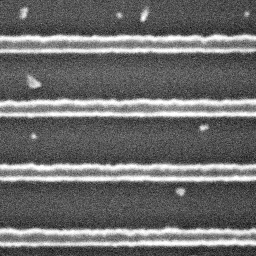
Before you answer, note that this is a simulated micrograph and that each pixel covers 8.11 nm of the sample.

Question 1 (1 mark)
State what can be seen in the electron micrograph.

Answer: lines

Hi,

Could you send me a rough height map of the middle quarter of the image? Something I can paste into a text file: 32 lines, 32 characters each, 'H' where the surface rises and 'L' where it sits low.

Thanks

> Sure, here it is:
LLLLLLLLLLLLLLLLLLLLLLLLLLLLLLLL
LLLLLLLLLLLLLLLLLLLLLLLLLLLLLLLL
LLLLLLLLLLLLLLLLLLLLLLLLLLLLLLLL
LLLLLLLLLLLLLLLLLLLLLLLLLLLLLLLL
LLLLLLLLLLLLLLLLLLLLLLLLLLLLLLLL
LLLLLLLLLLLLLLLLLLLLLLLLLLLLLLLL
LLLLLLLLLLLLLLLLLLLLLLLLLLLLLLLL
LLLLLLLLLLLLLLLLLLLLLLLLLLLLLLLL
LLLLLLLLLLLLLLLLLLLLLLLLLLLLLLLL
HHHHLLLHHHHHHLLHHHHHHHHHHHHHHHHH
HHHHHHHHHHHHHHHHHHHHHHHHHHHHHHHH
HHHHHHHHHHHHHHHHHHHHHHHHHHHHHHHH
HHHHHHHHHHHHHHHHHHHHHHHHHHHHHHHH
LLLLLLLLLLLLLLLLLLLLLLLLLLLLLLLL
LLLLLLLLLLLLLLLLLLLLLLLLLLLLLLLL
LLLLLLLLLLLLLLLLLLLLLLLLLLLLLLLL
LLLLLLLLLLLLLLLLLLLLLLLLLLLLLLLL
LLLLLLLLLLLLLLLLLLLLLLLLLLLLLLLL
LLLLLLLLLLLLLLLLLLLLLLLLLLLLLLLL
LLLLLLLLLLLLLLLLLLLLLLLLLLLLLLLL
LLLLLLLLLLLLLLLLLLLLLLLLLLLLLLLL
LLLLLLLLLLLLLLLLLLLLLLLLLLLLLLLL
LLLLLLLLLLLLLLLLLLLLLLLLLLLLLLLL
LLLLLLLLLLLLLLLLLLLLLLLLLLLLLLLL
LLLLLLLLLLLLLLLLLLLLLLLLLLLLLLLL
LLLLLHHLHLHLLLLLHLLLLLHHHHLLLLLL
HHHHHHHHHHHHHHHHHHHHHHHHHHHHHHHH
HHHHHHHHHHHHHHHHHHHHHHHHHHHHHHHH
HHHHHHHHHHHHHHHHHHHHHHHHHHHHHHHH
LLLLLLLLLLLLLLLLLLLLLLLLLLLLLLLL
LLLLLLLLLLLLLLLLLLLLLLLLLLLLLLLL
LLLLLLLLLLLLLLLLLLLLLLLLLLLLLLLL